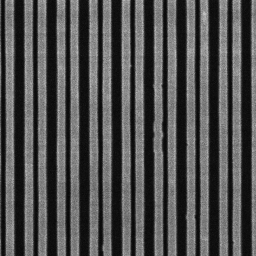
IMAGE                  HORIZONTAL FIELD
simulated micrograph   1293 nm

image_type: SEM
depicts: parallel lines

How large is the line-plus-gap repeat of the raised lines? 81.9 nm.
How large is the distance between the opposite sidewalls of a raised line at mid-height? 47.4 nm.